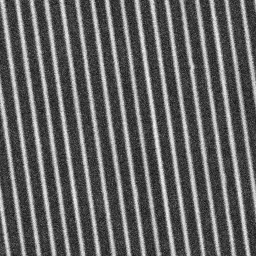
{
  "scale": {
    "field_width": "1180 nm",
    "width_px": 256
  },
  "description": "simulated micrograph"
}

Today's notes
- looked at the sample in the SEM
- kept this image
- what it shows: parallel lines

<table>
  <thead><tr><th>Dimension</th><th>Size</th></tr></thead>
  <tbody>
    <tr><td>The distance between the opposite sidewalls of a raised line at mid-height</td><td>15.4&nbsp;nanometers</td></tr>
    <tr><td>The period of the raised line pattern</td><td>68.4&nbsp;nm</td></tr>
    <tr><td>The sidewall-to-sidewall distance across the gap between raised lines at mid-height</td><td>54.2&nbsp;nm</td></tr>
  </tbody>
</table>